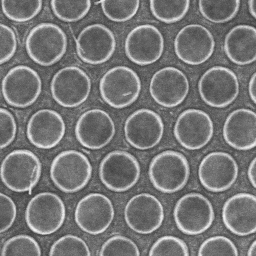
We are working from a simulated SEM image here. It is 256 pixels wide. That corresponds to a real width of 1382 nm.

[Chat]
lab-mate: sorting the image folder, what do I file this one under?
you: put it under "a regular array of raised bodies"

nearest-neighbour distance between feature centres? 263 nm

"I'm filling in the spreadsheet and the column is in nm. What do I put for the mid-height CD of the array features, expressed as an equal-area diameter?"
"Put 209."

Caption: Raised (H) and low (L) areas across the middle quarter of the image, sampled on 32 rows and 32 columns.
LLLLLLLLLLLLLLLLLLLLLLLLLLLLLLLL
HHHHLLLLLLLLHHHHHLLLLLLLHHHHLLLL
HHHHHLLLLLLHHHHHHHLLLLLHHHHHHHLL
HHHHHHLLLLHHHHHHHHHLLLHHHHHHHHLL
HHHHHHLLLHHHHHHHHHHLLLHHHHHHHHHL
HHHHHHLLLHHHHHHHHHHLLHHHHHHHHHHL
HHHHHHLLLHHHHHHHHHHLLHHHHHHHHHHL
HHHHHHLLLHHHHHHHHHHLLLHHHHHHHHHL
HHHHHLLLLLHHHHHHHHLLLLHHHHHHHHLL
HHHHLLLLLLLHHHHHHLLLLLLHHHHHHLLL
LLLLLLLLLLLLLHHLLLLLLLLLLHHHLLLL
LLLLLLLHHLLLLLLLLLLLLLLLLLLLLLLL
LLLLLHHHHHHLLLLLLHHHHHHLLLLLLLHH
LLLLHHHHHHHHLLLLHHHHHHHHLLLLLHHH
LLLLHHHHHHHHLLLLHHHHHHHHLLLLHHHH
LLLHHHHHHHHHLLLHHHHHHHHHLLLLHHHH
LLLHHHHHHHHHHLLHHHHHHHHHLLLLHHHH
LLLHHHHHHHHHLLLHHHHHHHHHLLLLHHHH
LLLLHHHHHHHHLLLLHHHHHHHHLLLLHHHH
LLLLHHHHHHHLLLLLHHHHHHHLLLLLLHHH
LLLLLHHHHHLLLLLLLHHHHHLLLLLLLLHH
LLLLLLLLLLLLLLLLLLLLLLLLLLLLLLLL
HHHHLLLLLLLHHHHHLLLLLLLLHHHHLLLL
HHHHHHLLLLHHHHHHHLLLLLLHHHHHHHLL
HHHHHHLLLLHHHHHHHHLLLLHHHHHHHHLL
HHHHHHHLLHHHHHHHHHLLLLHHHHHHHHHL
HHHHHHHLLHHHHHHHHHHLLHHHHHHHHHHL
HHHHHHHLLHHHHHHHHHHLLHHHHHHHHHHL
HHHHHHLLLHHHHHHHHHLLLLHHHHHHHHHL
HHHHHHLLLLHHHHHHHHLLLLHHHHHHHHLL
HHHHHLLLLLLHHHHHHLLLLLLHHHHHHHLL
HHHLLLLLLLLLLHHLLLLLLLLLHHHHLLLL